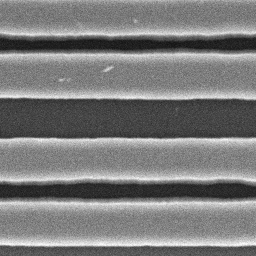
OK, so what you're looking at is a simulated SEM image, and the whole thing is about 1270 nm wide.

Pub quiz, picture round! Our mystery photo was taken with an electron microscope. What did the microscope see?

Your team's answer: lines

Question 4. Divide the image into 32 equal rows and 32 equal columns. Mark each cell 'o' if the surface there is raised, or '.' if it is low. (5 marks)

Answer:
oooooooooooooooooooooooooooooooo
oooooooooooooooooooooooooooooooo
oooooooooooooooooooooooooooooooo
oooooooooooooooooooooooooooooooo
.oooooooooooooooooooooooooo.....
................................
......................oo........
oooooooooooooooooooooooooooooooo
oooooooooooooooooooooooooooooooo
oooooooooooooooooooooooooooooooo
oooooooooooooooooooooooooooooooo
oooooooooooooooooooooooooooooooo
................................
................................
................................
................................
................................
.ooooooo..oooooooooo.ooooooooooo
oooooooooooooooooooooooooooooooo
oooooooooooooooooooooooooooooooo
oooooooooooooooooooooooooooooooo
oooooooooooooooooooooooooooooooo
oooooooooo...oooooooooooooo...oo
................................
................................
oooooooooooooooooooooooooooooooo
oooooooooooooooooooooooooooooooo
oooooooooooooooooooooooooooooooo
oooooooooooooooooooooooooooooooo
oooooooooooooooooooooooooooooooo
oooooooooooooooooooooooooooooooo
................................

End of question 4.